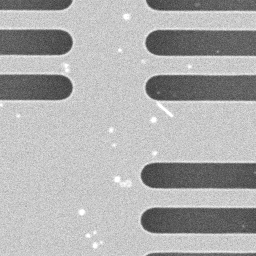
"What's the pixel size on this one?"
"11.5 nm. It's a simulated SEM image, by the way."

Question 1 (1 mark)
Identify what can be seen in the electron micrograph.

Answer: groups of lines, slits or small figures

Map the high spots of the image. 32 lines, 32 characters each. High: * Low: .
.........*********..............
********************************
********************************
********************************
.........*********..............
.........*********..............
.........**********.............
********************************
********************************
........***********.............
.........*********..............
.........*********..............
.......*************............
********************************
********************************
********************************
********************************
********************************
********************************
********************************
******************..............
******************..............
******************..............
*******************.............
********************************
********************************
******************..............
******************..............
******************..............
********************************
********************************
********************************